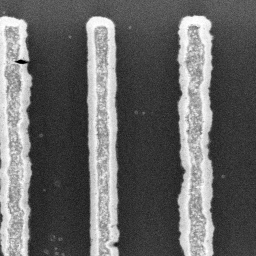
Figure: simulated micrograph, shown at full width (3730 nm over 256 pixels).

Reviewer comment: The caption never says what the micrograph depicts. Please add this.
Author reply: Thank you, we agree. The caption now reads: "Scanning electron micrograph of one or a few lines or trenches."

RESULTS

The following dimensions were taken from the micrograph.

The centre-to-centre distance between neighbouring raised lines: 1320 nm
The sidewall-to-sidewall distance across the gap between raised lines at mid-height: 1040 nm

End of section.